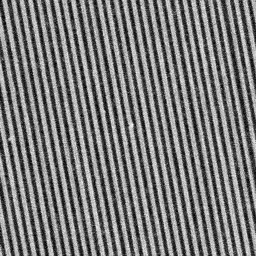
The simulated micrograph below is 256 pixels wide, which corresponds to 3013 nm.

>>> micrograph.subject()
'parallel lines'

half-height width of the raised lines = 0.0419 microns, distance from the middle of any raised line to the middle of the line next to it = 0.0993 µm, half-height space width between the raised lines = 63.7 nanometers